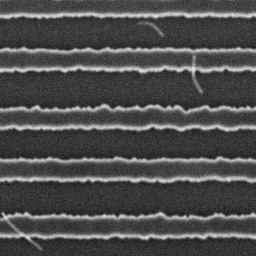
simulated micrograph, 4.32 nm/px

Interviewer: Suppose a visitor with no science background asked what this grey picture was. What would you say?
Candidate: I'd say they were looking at lines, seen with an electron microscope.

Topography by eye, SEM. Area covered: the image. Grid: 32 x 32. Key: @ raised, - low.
@@@@@@@@@@@@@@@@@@@@@@@@@@@@@@@@
@@@@@@@@@@@@@@@@@@@@@@@@@@@@@@@@
--------------------------------
--------------------------------
--------------------------------
--------------------------------
@@@@@@@@@@@@@@@@@@@@@@@@@@@@@@@@
@@@@@@@@@@@@@@@@@@@@@@@@@@@@@@@@
@@@@@@@@@@@@@@@@@@@@@@@@@@@@@@@@
--------------------------------
--------------------------------
--------------------------------
--------------------------------
--@-@----@--@@@@@@@@@@@--@-@@-@@
@@@@@@@@@@@@@@@@@@@@@@@@@@@@@@@@
@@@@@@@@@@@@@@@@@@@@@@@@@@@@@@@@
--------------------------------
--------------------------------
--------------------------------
--------------------------------
@@@@@@@@@@@@@@@@@@@@@@@@@@@@@@@@
@@@@@@@@@@@@@@@@@@@@@@@@@@@@@@@@
@@-@---@@@@@-@--@@@@@@--@------@
--------------------------------
--------------------------------
--------------------------------
--------------------------------
@@@@@@@@@@@@@@@@@@@@@@@@@@@@@@@@
@@@@@@@@@@@@@@@@@@@@@@@@@@@@@@@@
@@@@@@@@@@@@@@-@@@@@@@@@@@---@@@
--------------------------------
--------------------------------